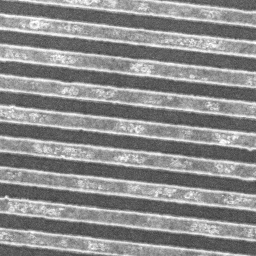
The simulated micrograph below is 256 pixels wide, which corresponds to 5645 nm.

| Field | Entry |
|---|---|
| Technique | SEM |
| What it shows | parallel lines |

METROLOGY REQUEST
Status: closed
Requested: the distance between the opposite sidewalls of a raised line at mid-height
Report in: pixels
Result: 14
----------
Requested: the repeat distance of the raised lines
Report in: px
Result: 30.4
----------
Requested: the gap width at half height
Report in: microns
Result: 0.353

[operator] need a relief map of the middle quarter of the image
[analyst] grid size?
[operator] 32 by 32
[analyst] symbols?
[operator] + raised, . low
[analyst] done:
.++++++++++++++++++++++++++++++.
........++++++++++++++++++++++++
.................+++++++++++++++
..........................++++++
................................
++++++++........................
+++++++++++++++++...............
++++++++++++++++++++++++++......
...+++++++++++++++++++++++++++++
............++++++++++++++++++++
.....................+++++++++++
..............................++
+...............................
++++++++++......................
+++++++++++++++++++.............
++++++++++++++++++++++++++++....
.......+++++++++++++++++++++++++
................++++++++++++++++
.........................+++++++
................................
+++++...........................
++++++++++++++..................
+++++++++++++++++++++++.........
+++++++++++++++++++++++++++++++.
.........+++++++++++++++++++++++
..................++++++++++++++
...........................+++++
................................
+++++++.+.......................
++++++++++++++++................
+++++++++++++++++++++++++.......
....++++++++++++++++++++++++++++